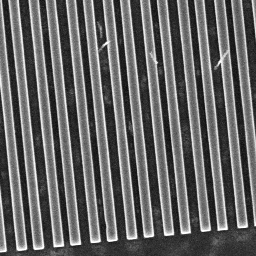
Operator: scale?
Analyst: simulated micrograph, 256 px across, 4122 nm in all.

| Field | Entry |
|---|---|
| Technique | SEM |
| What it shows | parallel lines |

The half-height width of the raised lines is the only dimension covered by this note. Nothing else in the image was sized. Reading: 146 nm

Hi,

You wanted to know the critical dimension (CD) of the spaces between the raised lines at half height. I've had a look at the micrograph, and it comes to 0.132 µm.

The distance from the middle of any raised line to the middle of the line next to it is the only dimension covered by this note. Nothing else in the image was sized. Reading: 0.296 microns